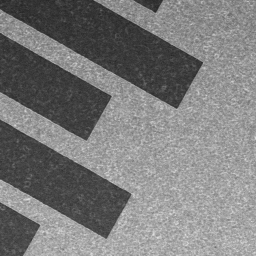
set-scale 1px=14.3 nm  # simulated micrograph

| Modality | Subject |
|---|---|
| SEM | one or a few lines or trenches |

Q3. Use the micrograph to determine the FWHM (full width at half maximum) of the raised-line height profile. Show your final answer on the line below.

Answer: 284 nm